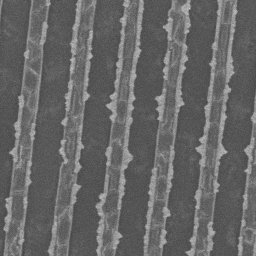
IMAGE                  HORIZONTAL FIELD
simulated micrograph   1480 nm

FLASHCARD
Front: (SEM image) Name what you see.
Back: parallel lines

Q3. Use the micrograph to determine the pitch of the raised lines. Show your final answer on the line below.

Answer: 270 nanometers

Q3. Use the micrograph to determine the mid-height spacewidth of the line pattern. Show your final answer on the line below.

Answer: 0.159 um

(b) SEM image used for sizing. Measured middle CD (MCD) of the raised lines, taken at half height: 109 nanometres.